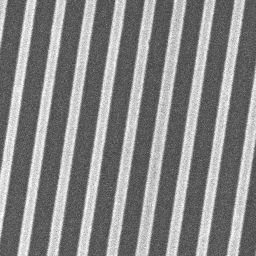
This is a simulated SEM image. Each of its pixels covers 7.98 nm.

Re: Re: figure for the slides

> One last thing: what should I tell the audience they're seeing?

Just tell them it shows parallel lines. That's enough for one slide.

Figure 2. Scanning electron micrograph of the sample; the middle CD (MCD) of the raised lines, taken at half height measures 76 nm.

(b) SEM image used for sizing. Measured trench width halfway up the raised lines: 159 nm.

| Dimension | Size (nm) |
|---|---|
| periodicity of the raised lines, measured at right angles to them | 236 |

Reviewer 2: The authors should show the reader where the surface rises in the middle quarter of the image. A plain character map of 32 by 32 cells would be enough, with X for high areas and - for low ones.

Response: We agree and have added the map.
---XXX-----XX-----XX-----XXX----
---XX------XX-----XX-----XXX----
---XX-----XX------XX-----XXX----
---XX-----XX-----XXX-----XX-----
--XXX-----XX-----XXX-----XX-----
--XXX-----XX-----XXX-----XX-----
--XXX-----XX-----XX-----XXX-----
--XX------XX-----XX-----XXX-----
--XX-----XXX-----XX-----XXX-----
--XX-----XX------XX-----XX------
--XX-----XX-----XXX-----XX-----X
--XX-----XX-----XXX-----XX-----X
-XXX-----XX-----XXX-----XX-----X
-XXX-----XX-----XX-----XXX-----X
-XX------XX-----XX-----XXX-----X
-XX-----XXX-----XX-----XXX----XX
-XX-----XXX----XXX-----XXX----XX
-XX-----XX-----XXX-----XX-----XX
-XX-----XX-----XXX----XXX-----XX
XXX-----XX-----XXX----XXX-----XX
XX------XX-----XX-----XXX-----XX
XX-----XXX-----XX-----XXX-----XX
XX-----XX------XX-----XXX-----XX
XX-----XX-----XXX-----XX-----XXX
XX-----XX-----XXX----XXX-----XX-
XX-----XX-----XXX----XXX-----XX-
XX-----XX-----XX-----XXX-----XX-
X------XX-----XX-----XXX-----XX-
X-----XXX-----XX-----XXX-----XX-
X-----XXX----XXX-----XX------XX-
X-----XX-----XXX-----XX-----XXX-
X-----XX-----XXX----XXX-----XX--